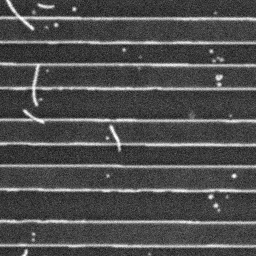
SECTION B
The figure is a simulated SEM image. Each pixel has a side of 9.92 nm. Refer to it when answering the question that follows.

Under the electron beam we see lines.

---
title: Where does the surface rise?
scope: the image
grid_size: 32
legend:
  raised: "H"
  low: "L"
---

LLLLLLLLLLLLLLLLLLLLLLLLLLLLLLLL
LLLLLLLLLLLLLLLLLLLLLLLLLLLLLLLL
HHHHHHHHHHHHHHHHHHHHHHHHHHHHHHHH
HHHHHHHHHHHHHHHHHHHHHHHHHHHHHHHH
HHHHHHHHHHHHHHHHHHHHHHHHHHHHHHHH
LLLLLLLLLLLLLLLLLLLLLLLLLLLLLLLL
LLLLLLLLLLLLLLLLLLLLLLLLLLLLLLLL
LLLLLLLLLLLLLLLLLLLLLLLLLLLLLLLL
HHHHHHHHHHHHHHHHHHHHHHHHHHHHHHHH
HHHHHHHHHHHHHHHHHHHHHHHHHHHHHHHH
HHHHHHHHHHHHHHHHHHHHHHHHHHHHHHHH
LLLLLLLLLLLLLLLLLLLLLLLLLLLLLLLL
LLLLLLLLLLLLLLLLLLLLLLLLLLLLLLLL
LLLLLLLLLLLLLLLLLLLLLLLLLLLLLLLL
LLLLLLLLLLLLLLLLLLLLLLLLLLLLLLLL
HHHHHHHHHHHHHHHHHHHHHHHHHHHHHHHH
HHHHHHHHHHHHHHHHHHHHHHHHHHHHHHHH
HHHHHHHHHHHHHHHHHHHHHHHHHHHHHHHH
LLLLLLLLLLLLLLLLLLLLLLLLLLLLLLLL
LLLLLLLLLLLLLLLLLLLLLLLLLLLLLLLL
LLLLLLLLLLLLLLLLLLLLLLLLLLLLLLLL
HHHHHHHHHHHHHHHHHHHHHHHHHHHHHHHH
HHHHHHHHHHHHHHHHHHHHHHHHHHHHHHHH
HHHHHHHHHHHHHHHHHHHHHHHHHHHHHHHH
LLLLLLLLLLLLLLLLLLLLLLLLLLLLLLLL
LLLLLLLLLLLLLLLLLLLLLLLLLLLLLLLL
LLLLLLLLLLLLLLLLLLLLLLLLLLLLLLLL
LLLLLLLLLLLLLLLLLLLLLLLLLLLLLLLL
HHHHHHHHHHHHHHHHHHHHHHHHHHHHHHHH
HHHHHHHHHHHHHHHHHHHHHHHHHHHHHHHH
HHHHHHHHHHHHHHHHHHHHHHHHHHHHHHHH
LLLLLLLLLLLLLLLLLLLLLLLLLLLLLLLL